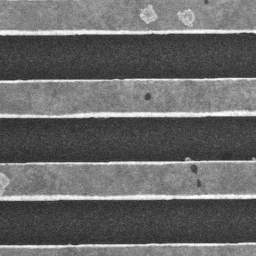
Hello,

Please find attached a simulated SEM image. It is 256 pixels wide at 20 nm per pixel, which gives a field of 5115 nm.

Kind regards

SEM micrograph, lines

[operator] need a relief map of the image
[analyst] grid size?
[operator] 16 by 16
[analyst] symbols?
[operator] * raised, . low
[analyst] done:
****************
****************
................
................
................
****************
****************
................
................
................
****************
****************
................
................
................
****************